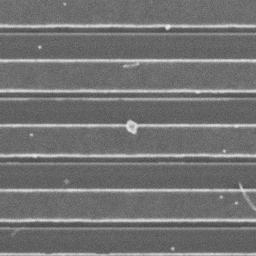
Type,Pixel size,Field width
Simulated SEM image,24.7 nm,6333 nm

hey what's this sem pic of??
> lines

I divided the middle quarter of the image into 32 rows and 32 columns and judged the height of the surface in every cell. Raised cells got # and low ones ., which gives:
################################
################################
################################
################################
################################
################################
################################
................................
................................
................................
................................
................................
................................
................................
................#...............
################################
################################
################################
################################
################################
################################
################################
################################
................................
................................
................................
................................
................................
................................
................................
................................
################################